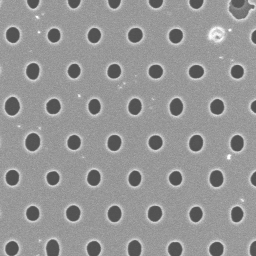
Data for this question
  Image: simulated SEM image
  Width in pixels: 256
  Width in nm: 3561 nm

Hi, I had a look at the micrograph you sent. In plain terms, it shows a regular array of holes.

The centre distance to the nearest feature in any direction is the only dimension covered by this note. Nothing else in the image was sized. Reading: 0.564 um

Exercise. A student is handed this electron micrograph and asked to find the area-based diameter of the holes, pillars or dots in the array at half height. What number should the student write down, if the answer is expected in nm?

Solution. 205